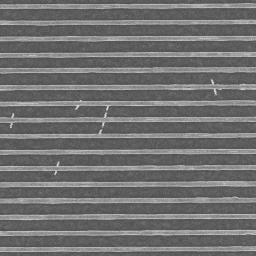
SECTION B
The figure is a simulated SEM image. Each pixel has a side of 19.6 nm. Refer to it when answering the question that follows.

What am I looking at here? parallel lines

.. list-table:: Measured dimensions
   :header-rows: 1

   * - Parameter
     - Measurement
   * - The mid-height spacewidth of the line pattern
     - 228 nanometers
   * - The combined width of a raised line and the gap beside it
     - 0.317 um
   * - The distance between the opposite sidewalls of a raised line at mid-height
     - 90.6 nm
